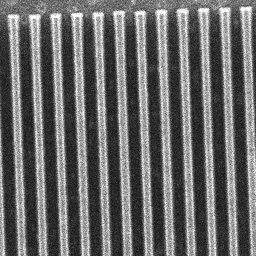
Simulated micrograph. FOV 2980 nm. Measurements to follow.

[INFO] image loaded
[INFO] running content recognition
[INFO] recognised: parallel lines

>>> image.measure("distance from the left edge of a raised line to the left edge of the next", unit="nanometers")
246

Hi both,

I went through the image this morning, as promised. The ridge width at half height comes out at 103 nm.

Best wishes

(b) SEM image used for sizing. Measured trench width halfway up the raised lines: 142 nm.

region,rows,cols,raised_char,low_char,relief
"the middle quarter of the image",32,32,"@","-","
---@@---@@---@@----@@---@@---@@-
---@@---@@---@@----@@---@@---@@-
---@@---@@---@@@---@@---@@---@@-
---@@---@@---@@@---@@---@@---@@-
---@@---@@---@@----@@---@@---@@-
---@@---@@---@@@---@@---@@---@@-
---@@---@@---@@@---@@---@@---@@@
---@@---@@----@@---@@---@@---@@@
---@@---@@----@@---@@---@@---@@@
---@@---@@----@@---@@---@@---@@@
---@@---@@----@@---@@---@@---@@@
---@@---@@----@@---@@---@@---@@@
---@@---@@---@@@---@@---@@----@@
---@@---@@----@@---@@---@@----@@
---@@---@@----@@---@@---@@@---@@
---@@----@----@@---@@---@@@---@@
---@@----@@---@@---@@---@@@---@@
---@@@---@@---@@---@@---@@@---@@
---@@@---@@---@@---@@---@@@---@@
---@@@---@@---@@---@@----@----@@
---@@@---@@---@@---@@----@@---@@
---@@@---@@---@@---@@----@@---@@
---@@@---@@---@@---@@@---@@---@@
----@@---@@---@@---@@@---@@---@@
----@@---@@---@@---@@----@@---@@
----@@---@@---@@---@@@---@@---@@
----@@---@@---@@---@@@---@@---@@
----@@---@@---@@----@@---@@---@@
----@@---@@---@@----@@---@@---@@
----@@---@@---@@@---@@---@@---@@
----@@---@@---@@@---@@---@@---@@
@---@@---@@---@@@---@@---@@---@@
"